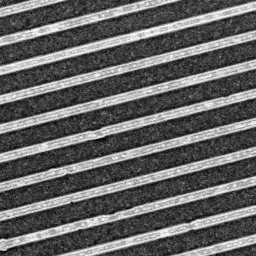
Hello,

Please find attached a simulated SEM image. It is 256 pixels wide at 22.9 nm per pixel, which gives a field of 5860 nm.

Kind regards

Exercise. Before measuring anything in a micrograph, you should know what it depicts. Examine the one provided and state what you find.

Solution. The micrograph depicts parallel lines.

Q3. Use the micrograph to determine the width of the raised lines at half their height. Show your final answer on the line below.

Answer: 172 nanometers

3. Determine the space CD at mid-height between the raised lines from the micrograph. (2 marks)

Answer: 474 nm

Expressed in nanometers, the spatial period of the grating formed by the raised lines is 646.